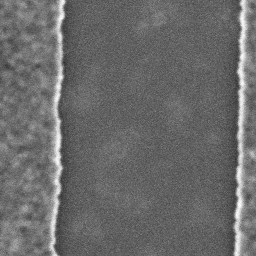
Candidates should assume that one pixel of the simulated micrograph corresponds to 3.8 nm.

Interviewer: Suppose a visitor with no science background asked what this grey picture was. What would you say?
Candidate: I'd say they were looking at one or a few lines or trenches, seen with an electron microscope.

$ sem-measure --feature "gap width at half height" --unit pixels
181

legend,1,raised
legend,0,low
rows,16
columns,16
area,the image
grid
1111000000000001
1111000000000001
1111000000000001
1111000000000001
1111000000000001
1111000000000001
1111000000000001
1111000000000001
1111000000000001
1111000000000001
1111000000000001
1111000000000001
1111000000000001
1110000000000001
1110000000000001
1110000000000001